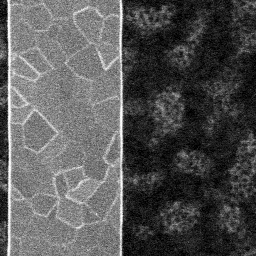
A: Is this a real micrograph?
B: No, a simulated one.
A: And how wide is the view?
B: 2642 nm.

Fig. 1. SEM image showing one or a few lines or trenches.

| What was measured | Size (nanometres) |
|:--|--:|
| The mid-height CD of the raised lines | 1160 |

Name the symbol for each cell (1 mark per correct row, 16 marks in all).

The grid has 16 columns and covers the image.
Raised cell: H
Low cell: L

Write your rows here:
LHHHHHHHLLLLLLLL
LHHHHHHHLLLLLLLL
LHHHHHHHLLLLLLLL
HHHHHHHHLLLLLLLL
LHHHHHHHLLLLLLLL
LHHHHHHHLLLLLLLL
LHHHHHHHLLLLLLLL
LHHHHHHHLLLLLLLL
LHHHHHHHLLLLLLLL
LHHHHHHHLLLLLLLL
LHHHHHHHLLLLLLLL
LHHHHHHHLLLLLLLL
LHHHHHHHLLLLLLLL
LHHHHHHHLLLLLLLL
LHHHHHHHLLLLLLLL
LHHHHHHHLLLLLLLL